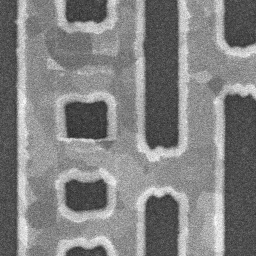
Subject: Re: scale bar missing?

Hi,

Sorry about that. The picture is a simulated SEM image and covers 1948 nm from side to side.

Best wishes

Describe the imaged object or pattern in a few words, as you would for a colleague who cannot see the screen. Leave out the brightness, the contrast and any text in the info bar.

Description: one or a few lines or trenches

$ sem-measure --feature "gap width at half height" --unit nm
324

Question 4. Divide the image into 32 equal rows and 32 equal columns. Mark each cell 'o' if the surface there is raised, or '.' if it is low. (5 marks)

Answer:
...oooo.......ooo......oooo.....
...oooo.......ooo......oooo.....
...ooooo......ooo......oooo.....
...ooooooo.o.oooo......oooo.....
...oooooooooooooo......oooo.....
...oooooooooooooo......ooooo....
...oooooooooooooo......oooooo..o
...oooooooooooooo......ooooooooo
...oooooooooooooo......ooooooooo
...oooooooooooooo......ooooooooo
...oooooooooooooo......ooooooooo
...oooooooooooooo......ooooo....
...ooooo......ooo......ooooo....
...oooo.......ooo......oooo.....
...ooooo......ooo......oooo.....
...ooooo......ooo......oooo.....
...ooooo......ooo......oooo.....
...oooooooooooooo......oooo.....
...ooooooooooooooo.....oooo.....
...oooooooooooooooooooooooo.....
...oooooooooooooooooooooooo.....
...oooooooooooooooooooooooo.....
...ooooo......ooooooooooooo.....
...ooooo......ooooooooooooo.....
...ooooo......oooo....ooooo.....
...ooooo......oooo.....oooo.....
...ooooo.....oooo......oooo.....
...oooooooooooooo......oooo.....
...oooooooooooooo......oooo.....
...oooooooooooooo......oooo.....
...ooooo.....oooo......oooo.....
...ooooo......ooo......oooo.....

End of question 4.